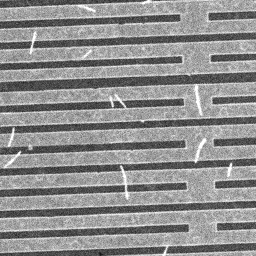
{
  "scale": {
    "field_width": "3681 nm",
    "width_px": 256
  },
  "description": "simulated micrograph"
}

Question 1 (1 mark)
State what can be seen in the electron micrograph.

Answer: parallel lines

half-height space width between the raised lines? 0.115 um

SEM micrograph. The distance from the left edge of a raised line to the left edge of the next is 302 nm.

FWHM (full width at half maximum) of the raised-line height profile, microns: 0.183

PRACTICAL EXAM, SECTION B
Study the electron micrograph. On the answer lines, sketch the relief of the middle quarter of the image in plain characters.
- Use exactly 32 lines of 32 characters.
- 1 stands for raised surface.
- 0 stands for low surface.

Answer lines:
00000000000000001111111111111111
11111111111111111111111111111111
11111111111111111111111111111111
11000000000000000000000000000000
00000000000000000000000000000000
00000000000000000000000011101111
00111111111111111111111111111111
11111111111111111111111111111111
11111111111111111111111111100011
11000000000000000000000000000011
00000000000000000000000000000011
00000000000111111111111111111111
11111111111111111111111111111111
11111111111111111111111111111111
11111111110000000000000000000000
00000000000000000000000000000000
00000000000000001111111111111111
11111111111111111111111111111111
11111111111111111111111111111111
11111111111111000000000000000001
00000000000000000000000000000001
00000000000000000000111111111111
11111111111111111111111111111111
11111111111111111111111111111111
11111111111111111111111000000000
00000000000000000000000000000000
00000000000000000000000000000111
00011111111111111111111111111111
11111111111111111111111111111111
11111111111111111111111111110011
11100000000000000000000000000001
00000000000000000000000000000011